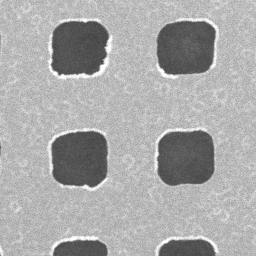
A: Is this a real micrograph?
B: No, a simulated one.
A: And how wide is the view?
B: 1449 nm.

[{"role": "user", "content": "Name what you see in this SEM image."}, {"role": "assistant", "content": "holes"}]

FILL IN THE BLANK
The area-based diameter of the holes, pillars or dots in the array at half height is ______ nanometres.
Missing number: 337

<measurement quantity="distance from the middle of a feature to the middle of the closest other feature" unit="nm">602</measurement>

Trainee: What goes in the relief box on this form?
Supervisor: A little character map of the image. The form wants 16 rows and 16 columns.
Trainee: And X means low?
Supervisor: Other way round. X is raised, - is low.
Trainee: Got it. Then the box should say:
XXXXXXXXXXXXXXXX
XXXX--XXXXX--XXX
XXX----XXX---XXX
XXX----XXX---XXX
XXXX--XXXX---XXX
XXXXXXXXXXXXXXXX
XXXXXXXXXXXXXXXX
XXXXXXXXXXXXXXXX
XXXX--XXXX---XXX
XXX----XXX---XXX
XXX----XXX---XXX
XXXX--XXXXX-XXXX
XXXXXXXXXXXXXXXX
XXXXXXXXXXXXXXXX
XXXXXXXXXXXXXXXX
XXXX---XXX---XXX